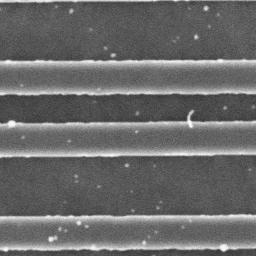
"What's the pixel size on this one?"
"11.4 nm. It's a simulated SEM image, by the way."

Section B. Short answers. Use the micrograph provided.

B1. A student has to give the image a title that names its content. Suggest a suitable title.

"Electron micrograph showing lines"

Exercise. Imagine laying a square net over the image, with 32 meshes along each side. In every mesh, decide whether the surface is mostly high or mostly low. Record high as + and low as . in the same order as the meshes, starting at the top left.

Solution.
................................
................................
................................
................................
................................
................................
................................
...........................+..+.
++++++++++++++++++++++++++++++++
++++++++++++++++++++++++++++++++
++++++++++++++++++++++++++++++++
++++++++++++++++++++++++++++++++
................................
................................
................................
.++..+..++++++++++++++++++++++++
++++++++++++++++++++++++++++++++
++++++++++++++++++++++++++++++++
++++++++++++++++++++++++++++++++
++.+............................
................................
................................
................................
................................
................................
................................
................................
++++++++++++++++++++++++++++++++
++++++++++++++++++++++++++++++++
++++++++++++++++++++++++++++++++
++++++++++++++++++++++++++++++++
................................